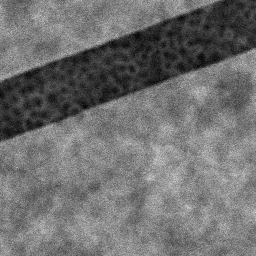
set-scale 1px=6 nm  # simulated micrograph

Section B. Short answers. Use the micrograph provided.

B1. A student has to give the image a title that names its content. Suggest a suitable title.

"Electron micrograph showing one or a few lines or trenches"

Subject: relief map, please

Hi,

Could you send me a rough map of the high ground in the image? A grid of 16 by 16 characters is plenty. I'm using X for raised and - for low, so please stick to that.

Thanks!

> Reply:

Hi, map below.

XXXXXXXXXXXX----
XXXXXXXXXX------
XXXXXXX---------
XXXX-----------X
X-----------XXXX
---------XXXXXXX
-------XXXXXXXXX
----XXXXXXXXXXXX
-XXXXXXXXXXXXXXX
XXXXXXXXXXXXXXXX
XXXXXXXXXXXXXXXX
XXXXXXXXXXXXXXXX
XXXXXXXXXXXXXXXX
XXXXXXXXXXXXXXXX
XXXXXXXXXXXXXXXX
XXXXXXXXXXXXXXXX